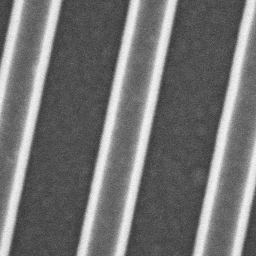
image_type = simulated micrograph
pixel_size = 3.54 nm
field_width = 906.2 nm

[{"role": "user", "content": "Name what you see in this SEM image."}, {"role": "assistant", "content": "one or a few lines or trenches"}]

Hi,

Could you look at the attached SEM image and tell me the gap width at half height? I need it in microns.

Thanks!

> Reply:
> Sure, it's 0.262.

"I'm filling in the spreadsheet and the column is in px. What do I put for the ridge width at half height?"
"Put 39.6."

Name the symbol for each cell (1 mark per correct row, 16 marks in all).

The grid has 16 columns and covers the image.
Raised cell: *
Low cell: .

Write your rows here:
.***....***.....
.**.....***....*
.**.....**.....*
***.....**.....*
***....***.....*
**.....***....**
**.....***....**
**.....**.....**
**.....**.....**
**....***.....**
*.....***....***
*.....**.....***
*.....**.....***
*.....**.....**.
*....***.....**.
.....***....***.